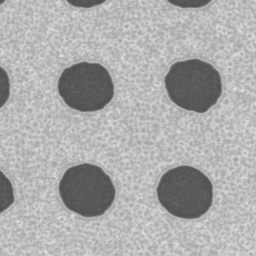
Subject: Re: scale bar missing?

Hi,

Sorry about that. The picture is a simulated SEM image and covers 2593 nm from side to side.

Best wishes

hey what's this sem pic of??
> holes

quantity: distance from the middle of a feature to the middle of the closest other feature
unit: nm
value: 1020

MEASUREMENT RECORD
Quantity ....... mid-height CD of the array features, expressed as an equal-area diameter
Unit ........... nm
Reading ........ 548